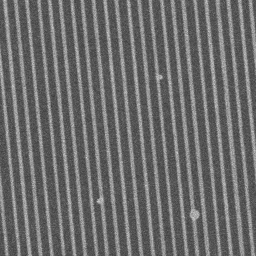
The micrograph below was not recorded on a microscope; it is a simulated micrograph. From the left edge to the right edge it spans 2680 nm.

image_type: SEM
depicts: parallel lines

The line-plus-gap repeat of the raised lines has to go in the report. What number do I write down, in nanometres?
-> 116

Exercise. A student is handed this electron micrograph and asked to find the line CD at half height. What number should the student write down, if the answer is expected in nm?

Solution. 27.3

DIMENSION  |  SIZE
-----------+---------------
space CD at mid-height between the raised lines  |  0.0821 um